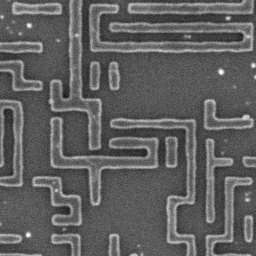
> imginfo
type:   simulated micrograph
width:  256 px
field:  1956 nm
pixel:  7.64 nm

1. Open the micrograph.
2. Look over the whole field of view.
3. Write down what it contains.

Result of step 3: wiring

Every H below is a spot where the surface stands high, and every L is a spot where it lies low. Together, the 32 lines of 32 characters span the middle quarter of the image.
LLHHLLLHHLLLHLLLLLLLLLLLLLLLLLLL
LLHHLLLHHLLHHLLLLLLLLLLLLLLLLLLL
LLHHLLLHHLLHHHLLLLLLLLLLLLLLLLLL
LLHHLLLHHLLHHHLLLLLLLLLLLLLLLLLL
LLHHLLLHHLLLHHLLLLLLLLLLLLLLLLLL
LLHHLLLHHLLLHHLLLLLLLLLLLLLLLLLL
LLHHLLLLLLLLLLLLLLLLLLLLLLLLLLLL
LLHHLLLLLLLLLLLLLLLLLLLLLLLLLLLL
LHHHHLLLLLLLLLLLLLLLLLLLLLLLLLLL
HHHHHHHHHLLLLLLLLLLLLLLLLLLLLLLL
HHHHHHHHHLLLLLLLLLLLLLLLLLLLLLLL
HHLHHHHHHLLLLLLLLLLLLLLLLLLLLLLL
LLLLLLHHHLLLLLLLLLLLLLLLLLLLLLLL
LLLLLLHHHLLLLLLLLLLLLLLLLLLLLLLL
LLLLLLHHHLLLHHHHHHHHHHHHHHHHHHHH
LLLLLLHHHLLLHHHHHHHHHHHHHHHHHHHH
LLLLLLHHHLLLLLLLLLLLLLLLLLLLLLHH
LLLLLLHHHLLLLLLLLLLLLLLLLLLLLLLH
LLLLLLHHHLLLLLLHHLLLLLLLLLHHLLLH
LLLLLLHHHLLLHHHHHHHHHHHLLLHHLLLH
LLLLLLHHHLLLHHHHHHHHHHHLLLHHLLLH
LLLLLLLLLLLLLLLLLLLLLHHLLLHHLLLH
LLLLLLLLLLLLLLLLLLLLLHHLLLHHLLLH
HHHHHHHHHHHHHHHHHHHHHHHLLLHHLLLH
HHHHHHHHHHHHHHHHHHHHHHHLLLHHLLLH
HHHHHHHHHHHHHHHHHHHHHHHLLLHHLLLH
LLLLLLHHHLLLLLLLLLLLLLLLLLLLLLLH
LLLLLLHHHLLLLLLLLLLLLLLLLLLLLLLH
LLLLLLHHHLLLLLLLLLLLLLLLLLLLLLLH
LLLLLLHHHLLLLLLLLLLLLLLLLLLLLLLH
LLLLLLHHHLLLLLLLLLLLLLLLLLLLLLLH
LLLLLLLHHLLLLLLLLLLLLLLLLLLLLLLH